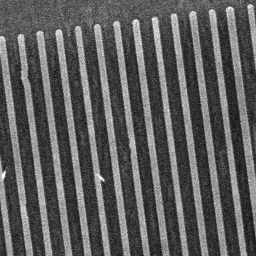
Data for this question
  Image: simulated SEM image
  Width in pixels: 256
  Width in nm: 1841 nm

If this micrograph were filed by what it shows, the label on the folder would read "parallel lines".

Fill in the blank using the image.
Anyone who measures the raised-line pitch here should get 138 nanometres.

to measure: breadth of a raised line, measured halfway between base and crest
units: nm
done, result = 47.2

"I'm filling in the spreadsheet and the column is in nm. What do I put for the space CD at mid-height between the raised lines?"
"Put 94.5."